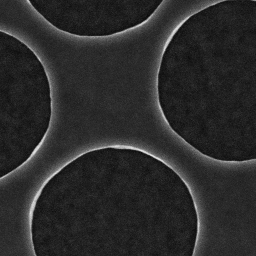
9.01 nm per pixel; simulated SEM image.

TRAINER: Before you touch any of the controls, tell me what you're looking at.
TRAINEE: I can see holes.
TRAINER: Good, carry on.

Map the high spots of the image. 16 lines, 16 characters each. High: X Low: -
XX--------XXX---
XXX------XX-----
-XXXXXXXXXX-----
--XXXXXXXX------
---XXXXXXX------
---XXXXXXX------
---XXXXXXX------
---XXXXXXX------
---XXXXXXXX-----
--XXX----XXXX---
-XXX-------XXXXX
XXX---------XXXX
XX----------XXXX
XX----------XXXX
XX----------XXXX
XX----------XXXX